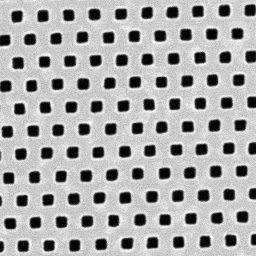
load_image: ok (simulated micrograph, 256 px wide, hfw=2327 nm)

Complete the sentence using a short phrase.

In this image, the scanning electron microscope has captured a regular array of holes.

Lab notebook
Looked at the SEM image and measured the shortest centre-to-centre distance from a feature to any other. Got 232 nm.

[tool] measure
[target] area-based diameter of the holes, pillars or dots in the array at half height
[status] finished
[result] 116 nm